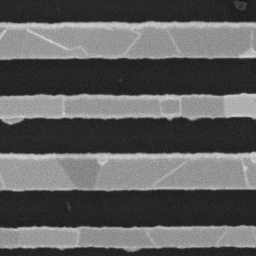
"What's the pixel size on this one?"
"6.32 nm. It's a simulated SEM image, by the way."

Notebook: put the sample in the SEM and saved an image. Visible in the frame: lines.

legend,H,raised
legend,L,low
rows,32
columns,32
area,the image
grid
LLLLLLLLLLLLLLLLLLLLLLLLLLLLLLLL
LLLLLLLLLLLLLLLLLLLLLLLLLLLLLLLL
LLLLLLLLLLLLLLLLLLLLLLLLLLLLLLLL
HHHHHHHHHHHHHHHHHHHHHHHHHHHHHHHH
HHHHHHHHHHHHHHHHHHHHHHHHHHHHHHHH
HHHHHHHHHHHHHHHHHHHHHHHHHHHHHHHH
HHHHHHHHHHHHHHHHHHHHHHHHHHHHHHHH
LLLLLLLLLLLLLLLLLLLLLLLLLLLLLLLL
LLLLLLLLLLLLLLLLLLLLLLLLLLLLLLLL
LLLLLLLLLLLLLLLLLLLLLLLLLLLLLLLL
LLLLLLLLLLLLLLLLLLLLLLLLLLLLLLLL
LLLLLLLLLLLLLLLLLLLLLLLLLLLLLLLL
HHHHHHHHHHHHHHHHHHHHHHHHHHHHHHHH
HHHHHHHHHHHHHHHHHHHHHHHHHHHHHHHH
HHHHHHHHHHHHHHHHHHHHHHHHHHHHHHHH
LLLLLLLLLLLLLLLLLLLLLLLLLLLLLLLL
LLLLLLLLLLLLLLLLLLLLLLLLLLLLLLLL
LLLLLLLLLLLLLLLLLLLLLLLLLLLLLLLL
LLLLLLLLLLLLLLLLLLLLLLLLLLLLLLLL
HHHHHHHHHHHHHHHHHHHHHHHHHHHHHHHH
HHHHHHHHHHHHHHHHHHHHHHHHHHHHHHHH
HHHHHHHHHHHHHHHHHHHHHHHHHHHHHHHH
HHHHHHHHHHHHHHHHHHHHHHHHHHHHHHHH
HHHHHHHHHHHHHHHHHHHHHHHHHHHHHHHH
LLLLLLLLLLLLLLLLLLLLLLLLLLLLLLLL
LLLLLLLLLLLLLLLLLLLLLLLLLLLLLLLL
LLLLLLLLLLLLLLLLLLLLLLLLLLLLLLLL
LLLLLLLLLLLLLLLLLLLLLLLLLLLLLLLL
LLHHHHHHHHHHHHHHHHHHHHHHHHHHHHHH
HHHHHHHHHHHHHHHHHHHHHHHHHHHHHHHH
HHHHHHHHHHHHHHHHHHHHHHHHHHHHHHHH
LLLLLLLLLLLLLLLLLLLLLLLLLLLLLLLL